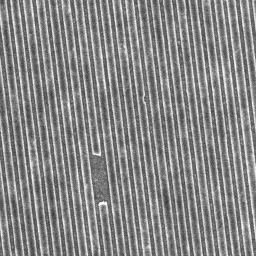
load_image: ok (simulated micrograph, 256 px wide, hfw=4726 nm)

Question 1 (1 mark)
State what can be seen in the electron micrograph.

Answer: parallel lines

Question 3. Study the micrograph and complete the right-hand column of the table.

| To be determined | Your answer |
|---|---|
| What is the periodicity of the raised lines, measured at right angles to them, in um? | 0.233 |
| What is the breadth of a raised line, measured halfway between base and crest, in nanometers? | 149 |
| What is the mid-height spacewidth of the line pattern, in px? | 4.34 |